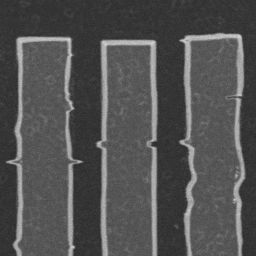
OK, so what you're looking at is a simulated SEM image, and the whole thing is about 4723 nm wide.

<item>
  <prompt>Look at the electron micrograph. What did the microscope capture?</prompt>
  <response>one or a few lines or trenches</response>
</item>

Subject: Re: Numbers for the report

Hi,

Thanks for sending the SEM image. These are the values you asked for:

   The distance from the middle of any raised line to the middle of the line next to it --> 1560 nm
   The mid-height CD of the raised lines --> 918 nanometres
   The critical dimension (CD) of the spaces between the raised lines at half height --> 643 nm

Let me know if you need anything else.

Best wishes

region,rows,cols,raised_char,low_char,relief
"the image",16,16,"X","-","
----------------
----------------
--XX--------XXX-
-XXX---XXX--XXX-
-XXX---XXX--XXX-
-XXX---XXX--XXX-
-XXX---XXX--XXX-
-XXX--XXXX--XXX-
-XXX--XXXX--XXX-
-XXX--XXXX--XXX-
-XXXX--XXX--XXX-
-XXX---XXX--XXX-
-XXX--XXXX--XXX-
-XXX--XXXX--XXX-
-XXX--XXXX--XXX-
-XXX---XXX--XXX-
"